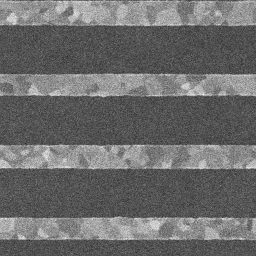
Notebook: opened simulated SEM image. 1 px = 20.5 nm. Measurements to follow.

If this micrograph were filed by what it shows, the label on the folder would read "one or a few lines or trenches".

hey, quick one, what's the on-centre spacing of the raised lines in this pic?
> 1470 nm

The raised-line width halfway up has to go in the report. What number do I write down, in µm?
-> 0.455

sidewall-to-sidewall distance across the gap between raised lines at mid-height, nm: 1020